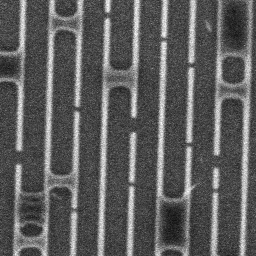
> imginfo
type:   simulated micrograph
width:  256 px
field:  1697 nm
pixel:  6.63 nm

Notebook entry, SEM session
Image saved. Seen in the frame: parallel lines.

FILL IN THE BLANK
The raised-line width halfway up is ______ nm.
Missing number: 24.8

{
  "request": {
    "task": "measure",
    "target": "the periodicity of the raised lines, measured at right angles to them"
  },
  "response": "0.187 micrometres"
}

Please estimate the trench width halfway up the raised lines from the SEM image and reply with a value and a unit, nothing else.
162 nm